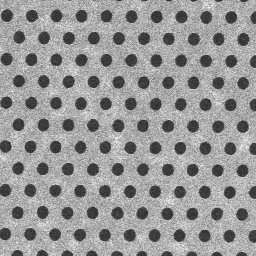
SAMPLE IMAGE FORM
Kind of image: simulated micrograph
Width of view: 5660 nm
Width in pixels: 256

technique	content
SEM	a regular array of holes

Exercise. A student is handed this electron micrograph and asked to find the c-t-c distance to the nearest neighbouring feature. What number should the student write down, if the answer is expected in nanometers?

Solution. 545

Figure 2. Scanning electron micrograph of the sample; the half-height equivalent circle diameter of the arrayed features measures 276 nanometers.